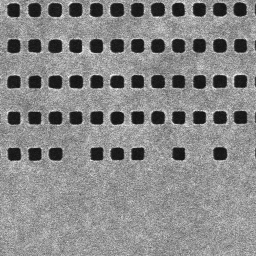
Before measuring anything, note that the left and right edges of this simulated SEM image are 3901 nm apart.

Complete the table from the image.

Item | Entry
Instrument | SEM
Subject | a regular array of holes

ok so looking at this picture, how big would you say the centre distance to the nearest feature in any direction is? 312 nanometres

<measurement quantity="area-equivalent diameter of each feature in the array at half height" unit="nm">225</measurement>